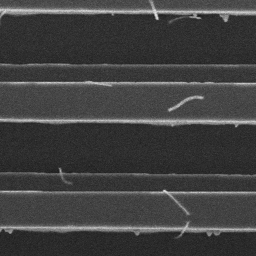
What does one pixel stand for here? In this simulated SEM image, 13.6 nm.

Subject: lines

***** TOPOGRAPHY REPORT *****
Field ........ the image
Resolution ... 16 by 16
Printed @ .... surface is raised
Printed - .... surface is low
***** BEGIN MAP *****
@@@@@@@@@@@@@@@@
----------------
----------------
----------------
----------------
@@@@@@@@@@@@@@@@
@@@@@@@@@@@@@@@@
@@@@@@@@@@@@@@@@
----------------
----------------
----------------
----------------
@@@@@@@@@@@@@@@@
@@@@@@@@@@@@@@@@
----------------
----------------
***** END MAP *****